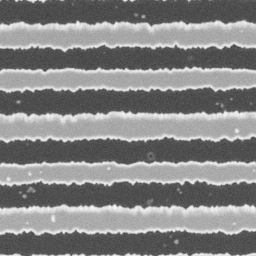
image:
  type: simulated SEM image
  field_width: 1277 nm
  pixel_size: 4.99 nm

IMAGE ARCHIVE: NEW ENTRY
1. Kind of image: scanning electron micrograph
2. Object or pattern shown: lines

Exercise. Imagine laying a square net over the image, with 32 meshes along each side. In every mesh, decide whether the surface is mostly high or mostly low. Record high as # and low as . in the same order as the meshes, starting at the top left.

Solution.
................................
................................
................................
################################
################################
################################
................................
................................
........................#.......
################################
################################
................................
................................
................................
..#...#...######################
################################
################################
##......#.......#.........#.....
................................
................................
.....##########..###############
################################
################################
................................
................................
................................
################################
################################
################################
................................
................................
................................